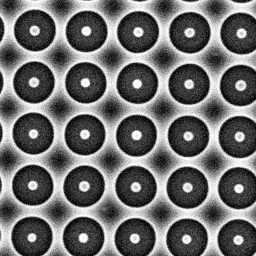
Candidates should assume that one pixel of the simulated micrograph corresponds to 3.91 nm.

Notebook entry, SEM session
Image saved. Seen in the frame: an array of small figures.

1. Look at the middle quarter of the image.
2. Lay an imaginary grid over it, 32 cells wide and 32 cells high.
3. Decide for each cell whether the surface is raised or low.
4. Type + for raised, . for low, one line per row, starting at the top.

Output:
++.......++++++......++++++++...
+.........++++........++++++....
+.........++++.........++++.....
...........++..........+++......
.....+.....++.....+.....++.....+
...........++.....+.....++.....+
...........++..........+++......
+.........++++.........++++.....
++.......+++++........+++++.....
+++.....++++++++.....+++++++....
++++++++++++++++++++++++++++++++
++++++++++++++++++++++++++++++++
++++..++++++++++++++++++++++++++
++.......++++++......+++++++....
+.........++++........+++++.....
..........++++.........+++......
..........+++..........+++......
....++.....++.....+....+++....++
.....+.....++..........+++....++
..........+++..........+++......
+.........++++.........+++......
++.......+++++........+++++.....
+++.....+++++++......+++++++....
++++++++++++++++++++++++++++++..
++++++++++++++++++++++++++++++++
++++...+++++++++...+++++++++++..
++.......++++++......+++++++....
+........+++++........+++++.....
..........+++..........+++......
..........+++..........+++......
....++....+++....++....++.....++
..........+++....++....++.....++